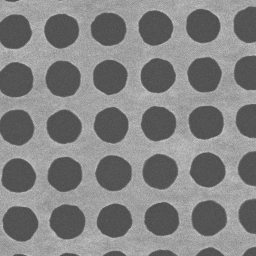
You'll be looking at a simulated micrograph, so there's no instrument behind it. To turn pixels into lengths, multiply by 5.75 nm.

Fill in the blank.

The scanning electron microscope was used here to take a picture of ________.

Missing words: a regular array of holes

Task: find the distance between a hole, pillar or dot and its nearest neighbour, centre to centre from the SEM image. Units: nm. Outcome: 270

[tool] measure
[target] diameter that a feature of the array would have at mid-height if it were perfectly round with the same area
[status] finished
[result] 200 nm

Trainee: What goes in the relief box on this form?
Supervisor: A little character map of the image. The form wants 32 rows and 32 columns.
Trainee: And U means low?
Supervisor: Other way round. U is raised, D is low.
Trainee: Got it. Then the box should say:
UUUUUUUUUUUUUUUUUUUUUUUUUUUUUUUU
UUUUUUUUUUUUUUUUUUDDUUUUDDUUUUDD
DDDUUUDDDUUUDDDUUUDDDUUDDDDUUDDD
DDDDUUDDDDUDDDDDUDDDDDUDDDDUUDDD
DDDDUUDDDDUUDDDDUUDDDUUUDDDUUUDD
DDDUUUDDDUUUUDDUUUUDUUUUUUUUUUUU
UUUUUUUUUUUUUUUUUUUUUUUUUUUUUUUU
UUUUUUUUUUUUUUUUUUUDDUUUDDDUUUDD
DDDDUUDDDDUUDDDDUUDDDDUUDDDDUDDD
DDDDUUDDDDUUDDDDUUDDDDUUDDDDUDDD
DDDDUUDDDDUUDDDDUUDDDDUUDDDUUUDD
DDDDUUDDDDUUUDDUUUUDUUUUUDUUUUUU
UUUUUUUUUUUUUUUUUUUUUUUUUUUUUUUU
UUUUUUUUUUUUUUDUUUUDDUUUUDDUUUDD
DDDDUUDDDUUUDDDDUUDDDDUUDDDDUUDD
DDDDUUDDDDUUDDDDUUDDDDUUDDDDUUDD
DDDDUUDDDDUUDDDDUUDDDDUUDDDDUUDD
UDDDUUUDDUUUUDDUUUUDUUUUUUUUUUUU
UUUUUUUUUUUUUUUUUUUUUUUUUUUUUUUU
UUUUUUUUUUUUUUUUUUUDDUUUUDDUUUUD
UDDDUUDDDDUUDDDDUUDDDDUUDDDDUUDD
DDDDUUDDDDUUDDDDUUDDDDUUDDDDUUDD
DDDDUUDDDDUUDDDDUUDDDDUUDDDDUUDD
UDDDUUUDDUUUUDDUUUUDDUUUUUUUUUUU
UUUUUUUUUUUUUUUUUUUUUUUUUUUUUUUU
UUUUUUUUUUUUUUDUUUUUDUUUUDDUUUDD
UDDDUUUDDDUUUDDDUUDDDDUUDDDDUUDD
DDDDDUDDDDDUDDDDUUDDDDUUDDDDUUDD
DDDDDUDDDDUUDDDDUUDDDDUUDDDDUUUD
UDDDUUUDDDUUUDDUUUUUUUUUUUUUUUUU
UUUUUUUUUUUUUUUUUUUUUUUUUUUUUUUU
UUUUUUUUUUUUUUDUUUUDDUUUUDDUUUUD